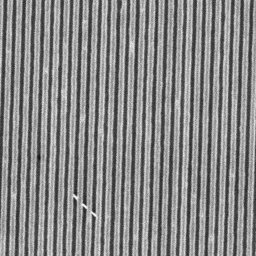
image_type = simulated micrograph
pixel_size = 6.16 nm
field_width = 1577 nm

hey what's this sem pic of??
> parallel lines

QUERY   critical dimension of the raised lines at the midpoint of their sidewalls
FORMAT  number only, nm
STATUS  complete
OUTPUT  30.8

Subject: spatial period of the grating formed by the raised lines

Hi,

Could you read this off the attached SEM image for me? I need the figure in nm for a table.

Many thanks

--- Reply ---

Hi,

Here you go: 58.4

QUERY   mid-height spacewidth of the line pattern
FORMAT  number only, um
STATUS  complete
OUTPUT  0.0262